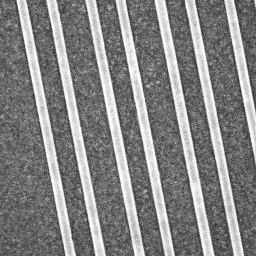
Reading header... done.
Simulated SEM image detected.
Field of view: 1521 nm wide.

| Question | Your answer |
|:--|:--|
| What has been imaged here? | parallel lines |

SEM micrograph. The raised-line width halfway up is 0.0547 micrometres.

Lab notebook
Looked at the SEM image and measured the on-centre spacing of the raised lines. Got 0.199 micrometres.